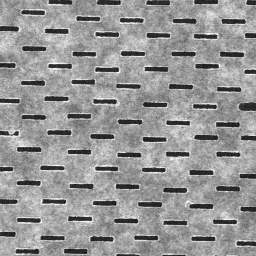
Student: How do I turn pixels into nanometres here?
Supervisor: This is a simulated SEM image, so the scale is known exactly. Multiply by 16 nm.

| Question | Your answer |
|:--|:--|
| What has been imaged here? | a regular array of holes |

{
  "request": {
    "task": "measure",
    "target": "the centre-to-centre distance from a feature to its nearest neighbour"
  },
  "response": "0.447 um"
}